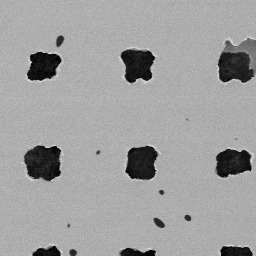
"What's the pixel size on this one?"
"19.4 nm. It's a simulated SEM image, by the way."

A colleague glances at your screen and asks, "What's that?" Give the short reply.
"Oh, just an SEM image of holes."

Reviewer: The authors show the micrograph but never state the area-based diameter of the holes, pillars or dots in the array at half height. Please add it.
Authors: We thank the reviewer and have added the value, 640 nm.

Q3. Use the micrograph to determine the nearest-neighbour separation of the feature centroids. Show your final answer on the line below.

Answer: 1.83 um